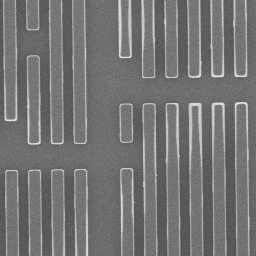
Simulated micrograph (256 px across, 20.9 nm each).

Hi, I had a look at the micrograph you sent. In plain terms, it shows groups of lines, slits or small figures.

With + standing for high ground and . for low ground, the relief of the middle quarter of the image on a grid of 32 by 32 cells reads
..+++...............+++...++...+
..+++...............+++...++...+
..+++...............+++...++...+
..+++...........................
..+++...........................
..+++...........................
...++...........................
...++...........................
...++...........................
...++...........................
...++.........+++...+++...++....
...++.........+++...+++...++....
...++.........+++...+++...++....
...++.........+++...+++...++....
...++.........+++...+++...++....
...++.........+++...+++...++....
...++.........+++...+++...++....
...++.........+++...+++...++....
...++.........+++...+++...++....
...++...............+++...++....
....................+++...++....
....................+++...++....
....................+++...++....
....................+++...+++...
....................+++...+++...
....................+++...+++...
...++.........+++...+++...+++...
...+++........+++...+++...+++...
...+++........+++...+++...+++...
...+++........+++...+++...+++...
...+++........+++...+++...+++...
...+++........+++...+++...+++...